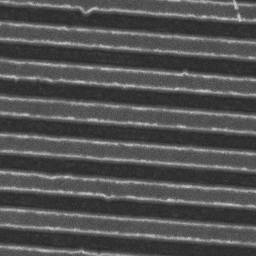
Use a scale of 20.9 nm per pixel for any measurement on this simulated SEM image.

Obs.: parallel lines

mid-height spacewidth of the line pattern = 367 nm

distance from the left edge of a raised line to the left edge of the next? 774 nanometres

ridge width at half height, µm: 0.406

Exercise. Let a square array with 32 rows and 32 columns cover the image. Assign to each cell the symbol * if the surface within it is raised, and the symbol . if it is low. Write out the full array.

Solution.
.*******************************
..........*....*****************
............................****
***********.....................
***********************.........
......**************************
...................*************
*...............................
***************.................
****************************....
...........*********************
........................********
*******.........................
********************............
.*******************************
..............******************
............................****
***********.....................
*************************.......
......**************************
...................*************
**..............................
***************.................
*****************************...
...........*********************
........................********
*******.........................
********************............
..******************************
...............*****************
.............................***
************....................